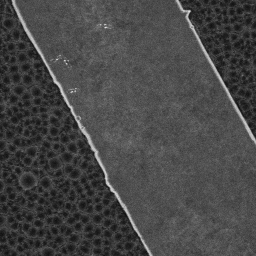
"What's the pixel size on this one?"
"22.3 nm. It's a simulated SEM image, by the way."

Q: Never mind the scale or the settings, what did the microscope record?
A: one or a few lines or trenches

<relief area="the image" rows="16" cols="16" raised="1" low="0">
0111111111100000
0111111111110000
0011111111110000
0001111111111000
0001111111111100
0000111111111100
0000111111111110
0000011111111110
0000011111111111
0000001111111111
0000001111111111
0000000111111111
0000000111111111
0000000011111111
0000000001111111
0000000001111111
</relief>